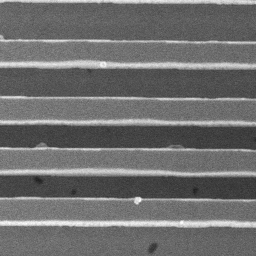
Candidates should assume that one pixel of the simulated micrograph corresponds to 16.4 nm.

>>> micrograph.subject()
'lines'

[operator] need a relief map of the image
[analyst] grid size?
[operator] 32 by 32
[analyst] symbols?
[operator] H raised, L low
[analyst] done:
LLLLLLLLLLLLLLLLLLLLLLLLLLLLLLLL
LLLLLLLLLLLLLLLLLLLLLLLLLLLLLLLL
LLLLLLLLLLLLLLLLLLLLLLLLLLLLLLLL
LLLLLLLLLLLLLLLLLLLLLLLLLLLLLLLL
LLLLLLLLLLLLLLLLLLLLLLLLLLLLLLLL
HHHHHHHHHHHHHHHHHHHHHHHHHHHHHHHH
HHHHHHHHHHHHHHHHHHHHHHHHHHHHHHHH
HHHHHHHHHHHHHHHHHHHHHHHHHHHHHHHH
LLLLLLLLLLLLLLLLLLLLLLLLHHHLLHHH
LLLLLLLLLLLLLLLLLLLLLLLLLLLLLLLL
LLLLLLLLLLLLLLLLLLLLLLLLLLLLLLLL
LLLLLLLLLLLLLLLLLLLLLLLLLLLLLLLL
HHHHHHHHHHHHHHHHHHHHHHHHHHHHHHHH
HHHHHHHHHHHHHHHHHHHHHHHHHHHHHHHH
HHHHHHHHHHHHHHHHHHHHHHHHHHHHHHHH
LLLLLLLLHHHHLHHHLLHHHHHHHHHHHHHH
LLLLLLLLLLLLLLLLLLLLLLLLLLLLLLLL
LLLLLLLLLLLLLLLLLLLLLLLLLLLLLLLL
LLLLLLLLLLLLLLLLLLLLLLLLLLLLLLLL
HHHHHHHHHHHHHHHHHHHHHHHHHHHHHHHH
HHHHHHHHHHHHHHHHHHHHHHHHHHHHHHHH
HHHHHHHHHHHHHHHHHHHHHHHHHHHHHHHH
LLLLLLLLLLLLLLLLLLLLLLLLLLLLLLLL
LLLLLLLLLLLLLLLLLLLLLLLLLLLLLLLL
LLLLLLLLLLLLLLLLLLLLLLLLLLLLLLLL
HHHHHHHHHHHHHHHHHHHHHHHHHHHHHHHH
HHHHHHHHHHHHHHHHHHHHHHHHHHHHHHHH
HHHHHHHHHHHHHHHHHHHHHHHHHHHHHHHH
LLLLLLLLLLLLLLLLLLLLLLLLLLLLLLLL
LLLLLLLLLLLLLLLLLLLLLLLLLLLLLLLL
LLLLLLLLLLLLLLLLLLLLLLLLLLLLLLLL
LLLLLLLLLLLLLLLLLLLLLLLLLLLLLLLL